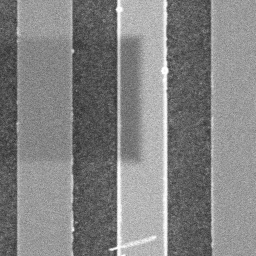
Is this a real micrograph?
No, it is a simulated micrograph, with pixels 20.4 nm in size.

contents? lines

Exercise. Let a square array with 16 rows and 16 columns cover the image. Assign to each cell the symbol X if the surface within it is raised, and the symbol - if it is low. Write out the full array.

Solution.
-XXX---XXX---XXX
-XXX---XXX---XXX
-XXX---XXX---XXX
-XXXX--XXX---XXX
-XXX---XXX---XXX
-XXX---XXX---XXX
-XXXX--XXX---XXX
-XXXX--XXX---XXX
-XXX---XXX---XXX
-XXXX--XXX---XXX
-XXXX--XXX---XXX
-XXXX--XXX---XXX
-XXXX--XXX---XXX
-XXXX--XXX---XXX
-XXXX--XXX---XXX
-XXXX--XXX---XXX